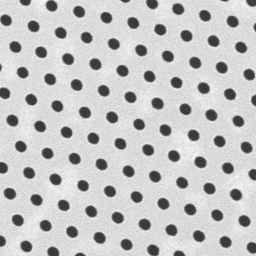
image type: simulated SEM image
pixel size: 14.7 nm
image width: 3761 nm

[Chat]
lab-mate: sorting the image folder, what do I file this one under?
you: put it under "a regular array of holes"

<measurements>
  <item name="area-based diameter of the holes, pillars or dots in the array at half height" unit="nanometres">176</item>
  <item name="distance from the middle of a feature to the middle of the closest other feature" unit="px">27.2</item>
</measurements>